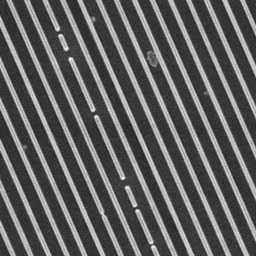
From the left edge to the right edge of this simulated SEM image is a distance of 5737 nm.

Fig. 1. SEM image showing parallel lines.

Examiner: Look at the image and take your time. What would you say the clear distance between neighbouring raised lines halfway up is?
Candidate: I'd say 292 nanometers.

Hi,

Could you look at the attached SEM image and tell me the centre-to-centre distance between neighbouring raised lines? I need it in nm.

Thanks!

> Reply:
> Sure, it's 368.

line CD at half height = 84.7 nanometers